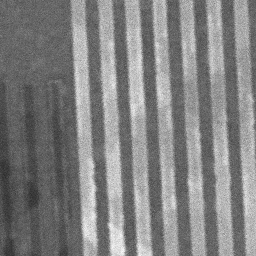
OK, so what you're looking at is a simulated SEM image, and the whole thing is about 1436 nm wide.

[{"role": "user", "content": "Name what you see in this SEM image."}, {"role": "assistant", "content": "parallel lines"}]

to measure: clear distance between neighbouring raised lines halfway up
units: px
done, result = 14.2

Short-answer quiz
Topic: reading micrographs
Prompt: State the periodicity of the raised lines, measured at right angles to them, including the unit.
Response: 152 nm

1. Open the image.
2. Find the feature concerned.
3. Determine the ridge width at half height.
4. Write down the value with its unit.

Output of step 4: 69.4 nm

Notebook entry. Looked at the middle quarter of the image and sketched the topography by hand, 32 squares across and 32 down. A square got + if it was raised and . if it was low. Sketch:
...+++....+++...+++....+++....++
...+++....+++...+++....+++....++
...+++....+++....++....+++....++
...+++....+++....++....+++....++
...+++....+++....++....+++....++
...+++....+++....+++....++....++
...+++....+++....+++....++....++
...+++....+++....+++....++....++
...+++....+++....+++....++....++
...+++....+++....+++....++....++
...+++....+++....+++....++....++
...+++....+++....+++....++....++
....++....+++....+++....+++...++
....++....+++....+++....+++....+
....+++...+++....+++....+++....+
....+++...+++....+++....+++....+
....+++...+++....+++....+++....+
....+++...+++....+++....+++....+
....+++....++....+++....+++....+
....+++....++....+++....+++....+
....+++....++....+++....+++....+
....+++....++....+++....+++....+
....+++....+++....++....+++....+
....+++....+++....++....+++....+
....+++....+++....++....+++....+
....+++....+++....+++....++....+
....+++....+++....+++....++....+
....+++....+++....+++....++....+
....+++....+++....+++....+++...+
....+++....+++....+++....+++...+
....++++...+++....+++....+++...+
....++++...+++....+++....+++...+